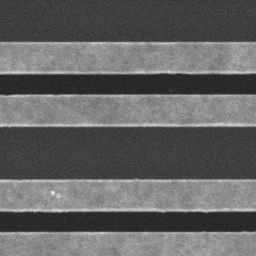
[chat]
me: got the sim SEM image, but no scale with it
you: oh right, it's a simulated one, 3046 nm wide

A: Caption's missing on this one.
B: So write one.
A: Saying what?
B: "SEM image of lines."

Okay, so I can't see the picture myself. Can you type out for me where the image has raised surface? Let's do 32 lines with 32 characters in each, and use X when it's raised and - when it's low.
--------------------------------
--------------------------------
--------------------------------
--------------------------------
--------------------------------
XXXXXXXXXXXXXXXXXXXXXXXXXXXXXXXX
XXXXXXXXXXXXXXXXXXXXXXXXXXXXXXXX
XXXXXXXXXXXXXXXXXXXXXXXXXXXXXXXX
XXXXXXXXXXXXXXXXXXXXXXXXXXXXXXXX
--------------------------------
--------------------------------
--------------------------------
XXXXXXXXXXXXXXXXXXXXXXXXXXXXXXXX
XXXXXXXXXXXXXXXXXXXXXXXXXXXXXXXX
XXXXXXXXXXXXXXXXXXXXXXXXXXXXXXXX
XXXXXXXXXXXXXXXXXXXXXXXXXXXXXXXX
--------------------------------
--------------------------------
--------------------------------
--------------------------------
--------------------------------
--------------------------------
--------------------------------
XXXXXXXXXXXXXXXXXXXXXXXXXXXXXXXX
XXXXXXXXXXXXXXXXXXXXXXXXXXXXXXXX
XXXXXXXXXXXXXXXXXXXXXXXXXXXXXXXX
--------------------------------
--------------------------------
--------------------------------
XXXXXXXXXXXXXXXXXXXXXXXXXXXXXXXX
XXXXXXXXXXXXXXXXXXXXXXXXXXXXXXXX
XXXXXXXXXXXXXXXXXXXXXXXXXXXXXXXX